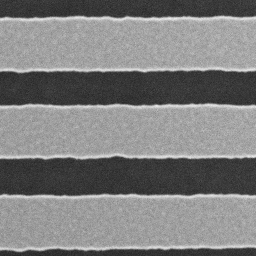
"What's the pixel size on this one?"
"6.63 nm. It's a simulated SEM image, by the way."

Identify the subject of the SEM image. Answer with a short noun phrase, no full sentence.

lines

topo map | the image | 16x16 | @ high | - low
----------------
@@@@@@@@@@@@@@@@
@@@@@@@@@@@@@@@@
@@@@@@@@@@@@@@@@
----------------
----------------
----------------
@@@@@@@@@@@@@@@@
@@@@@@@@@@@@@@@@
@@@@@@@@@@@@@@@@
----------------
----------------
@@@@@@@@@@@@@@@@
@@@@@@@@@@@@@@@@
@@@@@@@@@@@@@@@@
@@@@@@@@@@@@@@--